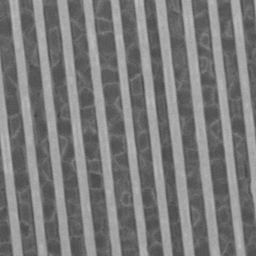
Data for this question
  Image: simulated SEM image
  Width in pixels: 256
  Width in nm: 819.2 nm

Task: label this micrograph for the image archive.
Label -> parallel lines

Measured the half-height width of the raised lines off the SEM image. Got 0.0282 microns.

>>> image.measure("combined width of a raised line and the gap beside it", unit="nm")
78.3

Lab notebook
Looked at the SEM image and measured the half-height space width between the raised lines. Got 50 nm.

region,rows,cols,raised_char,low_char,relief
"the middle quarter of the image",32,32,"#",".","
##.....##.....##....##...##....#
###....##.....##....##...##....#
.##....##.....##....##...##....#
.##....##.....##....##...##.....
.##....##.....##....##...###....
.##....##.....##....##...###....
.##....###....##....##...###....
.##.....##....##....##....##....
.##.....##.....#.....##...##....
.##.....##.....##....##...##....
..##....##.....##....##...##....
..##....##.....##....##...##....
..##....##.....##....##...##....
..##....##.....##....##...###...
..##....##.....##....##...###...
..##.....##....##....##....##...
..##.....##.....#....###...##...
..##.....##.....#.....##...##...
..##.....##.....##....##...##...
...##....##.....##....##...##...
...##....##.....##....##...##...
...##....##.....##....##...###..
...##....##.....##....##...###..
...##....##.....##....##...###..
...##.....##....##....##....##..
...##.....##.....#....###...##..
...##.....##.....#.....##...##..
...###....##.....##....##...##..
....##....##.....##....##...##..
....##....##.....##....##...##..
....##....##.....##....##...###.
....##....##.....##....##...###.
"